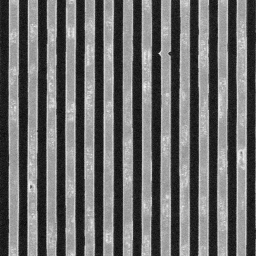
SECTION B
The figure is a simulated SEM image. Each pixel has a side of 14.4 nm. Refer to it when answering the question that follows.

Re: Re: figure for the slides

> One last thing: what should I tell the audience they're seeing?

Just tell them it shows parallel lines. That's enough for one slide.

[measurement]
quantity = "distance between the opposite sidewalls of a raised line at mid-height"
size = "0.13 microns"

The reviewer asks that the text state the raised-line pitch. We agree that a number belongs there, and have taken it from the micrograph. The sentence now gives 274 nanometers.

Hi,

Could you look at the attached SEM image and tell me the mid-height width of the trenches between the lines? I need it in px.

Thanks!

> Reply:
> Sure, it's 9.88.